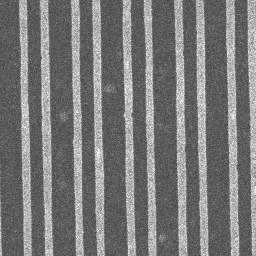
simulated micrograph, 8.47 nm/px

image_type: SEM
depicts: parallel lines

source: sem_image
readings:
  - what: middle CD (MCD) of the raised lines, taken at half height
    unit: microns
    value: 0.0657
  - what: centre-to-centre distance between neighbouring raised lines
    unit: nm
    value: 219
